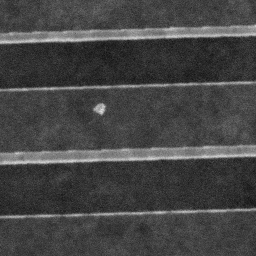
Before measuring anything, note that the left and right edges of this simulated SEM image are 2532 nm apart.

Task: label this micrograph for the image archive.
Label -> lines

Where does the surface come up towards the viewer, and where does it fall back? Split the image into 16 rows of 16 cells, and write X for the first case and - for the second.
XXXXXXXXXXXXXXXX
XXXXXXXXXXXXXXXX
XXX-------------
----------------
----------------
-----XXXXXXXXXXX
XXXXXXXXXXXXXXXX
XXXXXXXXXXXXXXXX
XXXXXXXXXXXXXXXX
XXXXXXXXXXXXXXXX
----------------
----------------
----------------
---XXXXXXXXXXXXX
XXXXXXXXXXXXXXXX
XXXXXXXXXXXXXXXX